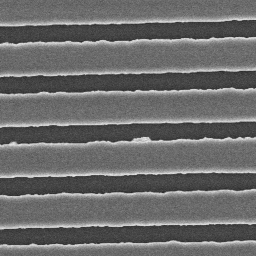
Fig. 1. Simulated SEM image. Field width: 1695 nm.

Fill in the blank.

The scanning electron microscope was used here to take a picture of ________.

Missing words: lines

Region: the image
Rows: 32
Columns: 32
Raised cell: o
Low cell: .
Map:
oooooooooooooooooooooooooooooooo
oooooooooooooooooooooooooooooooo
ooooooooooooooooooooooooooooooo.
................................
................................
o.oooooooooooooooooooooooooooooo
oooooooooooooooooooooooooooooooo
oooooooooooooooooooooooooooooooo
oooooooooooooooooooooooooooooooo
oooo............................
................................
...........ooooooooooooooooooooo
oooooooooooooooooooooooooooooooo
oooooooooooooooooooooooooooooooo
oooooooooooooooooooooooooooooooo
oooooooooooooo..................
................................
......................oo.ooooooo
oooooooooooooooooooooooooooooooo
oooooooooooooooooooooooooooooooo
oooooooooooooooooooooooooooooooo
oooooooooooooooooooooooooooooooo
................................
................................
o.oooooooooooooooooooooooooooooo
oooooooooooooooooooooooooooooooo
oooooooooooooooooooooooooooooooo
oooooooooooooooooooooooooooooooo
oooo.o..........................
................................
..........oooooooooooooooooooooo
oooooooooooooooooooooooooooooooo